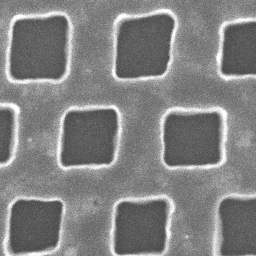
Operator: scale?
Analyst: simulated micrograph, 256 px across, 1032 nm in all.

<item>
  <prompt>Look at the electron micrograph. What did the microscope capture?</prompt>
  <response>holes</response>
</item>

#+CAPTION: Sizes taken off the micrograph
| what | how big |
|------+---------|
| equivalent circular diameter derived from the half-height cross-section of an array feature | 251 nm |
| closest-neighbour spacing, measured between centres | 0.415 micrometres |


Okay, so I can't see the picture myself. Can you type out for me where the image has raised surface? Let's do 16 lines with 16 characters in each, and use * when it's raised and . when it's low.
****************
*...***....****.
*...***....***..
*...***....***..
*...***...****..
****************
****************
.***...***....**
.***...***....**
.***...***....**
****************
****************
*.************..
*...***....***..
*...***...****..
*..****...****..